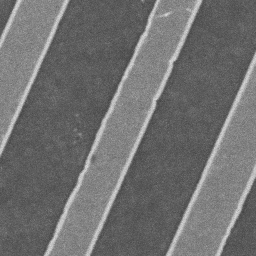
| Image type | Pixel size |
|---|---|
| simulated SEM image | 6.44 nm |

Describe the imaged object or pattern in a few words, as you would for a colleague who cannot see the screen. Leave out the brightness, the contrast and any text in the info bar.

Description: one or a few lines or trenches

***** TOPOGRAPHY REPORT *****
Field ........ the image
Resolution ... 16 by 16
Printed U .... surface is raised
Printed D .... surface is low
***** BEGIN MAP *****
DUUUDDDDDDUUDDDD
DUUUDDDDDUUUDDDD
UUUDDDDDDUUDDDDD
UUUDDDDDUUUDDDDD
UUDDDDDDUUUDDDDD
UUDDDDDUUUDDDDDU
UDDDDDDUUUDDDDDU
UDDDDDDUUDDDDDUU
DDDDDDUUUDDDDDUU
DDDDDDUUDDDDDUUU
DDDDDUUUDDDDDUUU
DDDDDUUDDDDDDUUU
DDDDUUUDDDDDUUUD
DDDDUUUDDDDDUUUD
DDDDUUDDDDDUUUDD
DDDUUUDDDDDUUUDD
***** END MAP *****